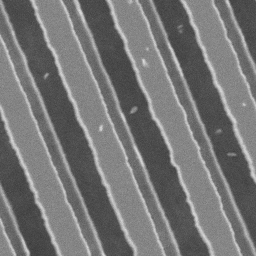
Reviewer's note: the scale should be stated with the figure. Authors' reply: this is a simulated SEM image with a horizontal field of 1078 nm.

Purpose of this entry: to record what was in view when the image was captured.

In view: lines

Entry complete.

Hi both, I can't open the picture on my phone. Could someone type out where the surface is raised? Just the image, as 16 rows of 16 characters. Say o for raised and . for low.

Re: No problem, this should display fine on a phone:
..ooo..ooo..oo..
o..oo..ooo..ooo.
o..ooo..oo..ooo.
o..ooo..ooo..ooo
oo..ooo.ooo..ooo
oo..ooo..ooo..oo
ooo..oo..ooo..oo
ooo..ooo..oo..oo
.oo..ooo..ooo..o
.ooo..ooo..oo..o
..oo..ooo..ooo..
..ooo..oo..ooo..
..ooo..ooo..ooo.
o..ooo.ooo..ooo.
o..ooo..ooo..oo.
oo.ooo..ooo..ooo